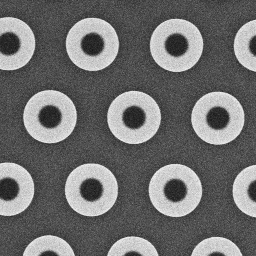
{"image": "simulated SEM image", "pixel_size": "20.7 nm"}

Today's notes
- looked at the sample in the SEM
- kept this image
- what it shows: an array of small figures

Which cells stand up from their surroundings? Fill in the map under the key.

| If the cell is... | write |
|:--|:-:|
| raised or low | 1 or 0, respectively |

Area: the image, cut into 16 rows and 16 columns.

0000000000000000
1100011000110001
1100111001111001
1100111000111001
0000000000000000
0000000000000000
0011100111001110
0111100111001110
0011000110001110
0000000000000000
1000011000110001
1100111001111001
1100111001110001
0000000000000000
0000000000000000
0011000111001110